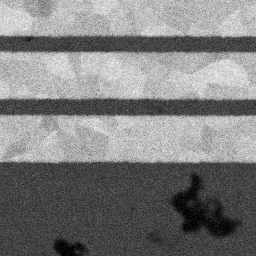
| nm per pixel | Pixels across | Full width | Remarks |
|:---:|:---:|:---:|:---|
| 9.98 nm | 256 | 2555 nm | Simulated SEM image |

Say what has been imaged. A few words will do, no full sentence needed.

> one or a few lines or trenches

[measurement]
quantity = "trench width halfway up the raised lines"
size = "170 nm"